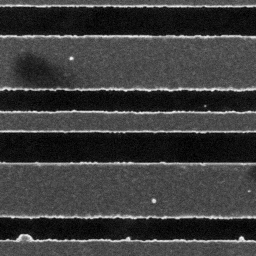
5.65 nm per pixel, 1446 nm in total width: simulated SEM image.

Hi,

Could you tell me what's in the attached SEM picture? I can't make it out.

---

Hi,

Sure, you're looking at lines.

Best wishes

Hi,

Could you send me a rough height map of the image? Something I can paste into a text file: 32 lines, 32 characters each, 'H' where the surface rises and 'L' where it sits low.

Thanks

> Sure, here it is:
HHHHHHHHHHHHHHHHHHHHHHHHHHHHHHHH
LLLLLLLLLLLLLLLLLLLLLLLLLLLLLLLL
LLLLLLLLLLLLLLLLLLLLLLLLLLLLLLLL
LLLLLLLLLLLLLLLLLLLLLLLLLLLLLLLL
LHLHHHHLLLHHHLHHHLLLLLLLHLLHHHLL
HHHHHHHHHHHHHHHHHHHHHHHHHHHHHHHH
HHHHHHHHHHHHHHHHHHHHHHHHHHHHHHHH
HHHHHHHHHHHHHHHHHHHHHHHHHHHHHHHH
HHHHHHHHHHHHHHHHHHHHHHHHHHHHHHHH
HHHHHHHHHHHHHHHHHHHHHHHHHHHHHHHH
HHHHHHHHHHHHHHHHHHHHHHHHHHHHHHHH
LLLLLLLLLLLLLLLLLLLLLLLLLLLLLLLL
LLLLLLLLLLLLLLLLLLLLLLLLLLLLLLLL
LLLLLLLLLLLLLLLLLLLLLLLLLLLLLLLL
HHHHHHHHHHHHHHHHHHHHHHHHHHHHHHHH
HHHHHHHHHHHHHHHHHHHHHHHHHHHHHHHH
LLLLLLLLLLLLLLLLLLLLLLLLLHLLLLLL
LLLLLLLLLLLLLLLLLLLLLLLLLLLLLLLL
LLLLLLLLLLLLLLLLLLLLLLLLLLLLLLLL
LLLLLLLLLLLLLLLLLLLLLLLLLLLLLLLL
HHHHHHHHHHHHHHHHHHHHHHHLLLLLLLLL
HHHHHHHHHHHHHHHHHHHHHHHHHHHHHHHH
HHHHHHHHHHHHHHHHHHHHHHHHHHHHHHHH
HHHHHHHHHHHHHHHHHHHHHHHHHHHHHHHH
HHHHHHHHHHHHHHHHHHHHHHHHHHHHHHHH
HHHHHHHHHHHHHHHHHHHHHHHHHHHHHHHH
HHHHHHHHHHHHHHHHHHHHHHHHHHHHHHHH
LLLLLLLLLLLLLLLLLLLLLLLLLLLLLLLL
LLLLLLLLLLLLLLLLLLLLLLLLLLLLLLLL
LLLHLLLLLLLLLLLLLLLLLLLLLLLLLLLL
HHHHHHHHHHHHHHHHHHHHHHHHHHHHHHHH
HHHHHHHHHHHHHHHHHHHHHHHHHHHHHHHH